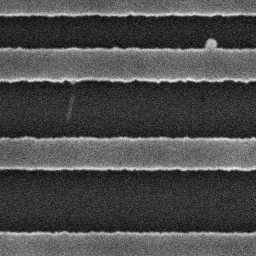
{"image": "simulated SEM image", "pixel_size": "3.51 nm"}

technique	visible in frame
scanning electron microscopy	lines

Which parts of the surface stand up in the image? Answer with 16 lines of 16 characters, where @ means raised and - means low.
@@@@@@@@@@@@@@@@
----------------
----------------
@@@@@@@@@@@@@@@@
@@@@@@@@@@@@@@@@
----------------
----------------
----------------
----------------
@@@@@@@@@@@@@@@@
@@@@@@@@@@@@@@@@
----------------
----------------
----------------
----------------
@@@@@@@@@@@@@@@@